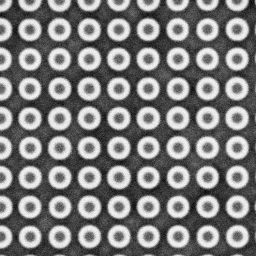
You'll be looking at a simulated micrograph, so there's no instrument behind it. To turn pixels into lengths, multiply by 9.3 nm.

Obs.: an array of small figures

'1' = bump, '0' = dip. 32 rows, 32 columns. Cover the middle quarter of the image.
10001111100011110001111000111110
00000110000000000000000000000000
00000000000000000000000000000000
00000110000000000000000000000000
10001111100011110001111000111110
11001111100111110011111100111110
11001111100111110011111100111110
10001111100111110001111000111110
00000111000011100000111000011100
00000000000000000000000000000000
00000000000000000000000000000000
10001111000011100001111000011100
10001111100111110011111100111110
11001111100111110011111100111110
11001111100111110011111100111110
10001111000011110001111000011100
00000000000000000000000000000000
00000000000000000000000000000000
00000110000011100000110000011100
10001111100111110001111000111110
11001111100111110011111100111110
11001111100111110011111100111110
10001111100111110001111000111110
00000110000001100000110000001100
00000000000000000000000000000000
00000000000000000000000000000000
10001111000011110001111000011110
11001111100111110001111100111110
11001111100111111001111100111110
11001111100111110001111100111110
10001111000011110001111000011100
00000000000000000000000000000000